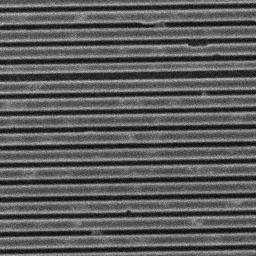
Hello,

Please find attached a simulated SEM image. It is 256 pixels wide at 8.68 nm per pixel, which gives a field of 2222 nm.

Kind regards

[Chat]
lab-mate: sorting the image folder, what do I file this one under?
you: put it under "parallel lines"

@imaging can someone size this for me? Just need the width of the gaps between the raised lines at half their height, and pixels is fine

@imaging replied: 6.24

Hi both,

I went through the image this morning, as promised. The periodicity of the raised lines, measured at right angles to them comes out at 150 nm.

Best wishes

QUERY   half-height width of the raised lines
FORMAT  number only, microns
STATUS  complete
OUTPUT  0.0933